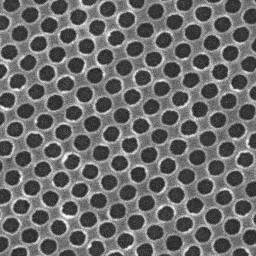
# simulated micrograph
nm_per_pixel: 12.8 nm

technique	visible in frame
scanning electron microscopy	a regular array of holes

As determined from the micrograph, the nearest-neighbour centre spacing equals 271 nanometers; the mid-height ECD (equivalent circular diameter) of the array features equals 16.7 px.